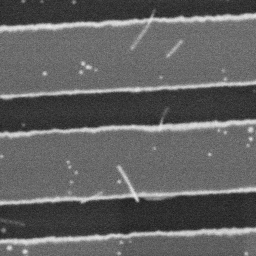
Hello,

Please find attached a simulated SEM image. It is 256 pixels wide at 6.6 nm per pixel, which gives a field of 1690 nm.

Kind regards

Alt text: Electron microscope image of lines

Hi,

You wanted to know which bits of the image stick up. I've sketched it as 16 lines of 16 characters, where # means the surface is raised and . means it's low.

................
....############
################
################
################
############....
................
................
################
################
################
################
######..........
................
.........#######
################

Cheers